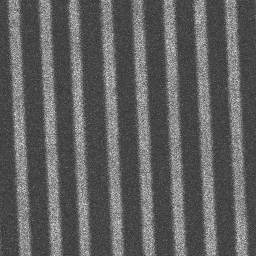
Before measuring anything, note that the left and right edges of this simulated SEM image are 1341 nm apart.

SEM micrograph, parallel lines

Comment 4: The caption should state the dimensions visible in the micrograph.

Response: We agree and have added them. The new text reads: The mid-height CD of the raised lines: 0.0543 micrometres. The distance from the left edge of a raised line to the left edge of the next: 162 nm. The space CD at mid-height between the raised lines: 109 nanometers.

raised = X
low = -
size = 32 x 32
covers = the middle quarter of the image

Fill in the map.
--XX------XXX-----XX------XX----
--XX------XXX-----XX------XX----
--XX------XXX-----XX------XX----
--XX------XXX-----XXX-----XX----
--XX------XXX-----XXX-----XX----
--XX------XXX-----XXX-----XX----
--XX------XXX-----XXX-----XX----
--XX-------XX-----XXX-----XX----
--XXX------XX-----XXX-----XXX---
--XXX------XX-----XXX-----XXX---
--XXX------XX-----XXX-----XXX---
--XXX------XX-----XXX-----XXX---
---XX------XX------XX-----XXX---
---XX------XX------XX-----XXX---
---XX------XX------XX-----XXX---
---XX------XX------XX-----XXX---
---XX------XX------XX------XX---
---XX------XX------XX------XX---
---XX------XX------XX------XX---
---XX------XX------XX------XX---
---XX------XXX-----XX------XX---
---XX------XXX-----XX------XX---
---XX------XXX-----XX------XX---
---XX------XXX-----XX------XX---
---XX------XXX-----XX------XX---
---XX------XXX-----XXX-----XX---
---XX------XXX-----XXX-----XX---
---XX------XXX-----XXX-----XX---
---XX------XXX-----XXX-----XX---
---XX-------XX-----XXX-----XXX--
---XXX------XX-----XXX-----XXX--
---XXX------XX-----XXX-----XXX--